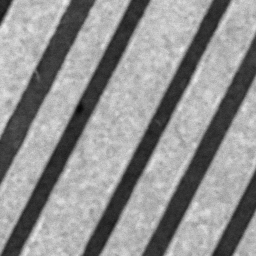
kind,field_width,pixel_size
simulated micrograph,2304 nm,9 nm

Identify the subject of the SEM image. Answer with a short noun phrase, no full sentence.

one or a few lines or trenches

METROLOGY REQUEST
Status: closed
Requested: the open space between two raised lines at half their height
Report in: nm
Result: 184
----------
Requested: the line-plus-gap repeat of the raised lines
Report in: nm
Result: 553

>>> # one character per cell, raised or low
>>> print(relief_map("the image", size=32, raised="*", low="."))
..******....****...*******...***
.*******...****...********..****
.******....****...*******...****
*******...****...********..*****
******....****...*******...*****
******...****...********..*****.
*****....****...*******...*****.
*****...****...*******...*****..
****....****...*******...*****..
****...****...*******...*****...
***....****...*******...*****...
***...****...*******...*****...*
**....****...*******...****....*
**...****...*******...*****...**
*....****...*******...****....**
*...****...*******...*****...***
....****...*******...****....***
...****...*******...*****...****
...****...*******...****....****
..****...*******...*****...*****
..****...*******...****....*****
.****...*******...*****...******
.****...*******...****....*****.
****...*******...*****...*****..
****..********...****....*****..
***...*******...*****...*****...
***..********...****....*****...
**...*******...*****...*****....
*...********...****...******...*
*...*******...*****...*****....*
*..********...****...******...**
...*******...*****...*****...***